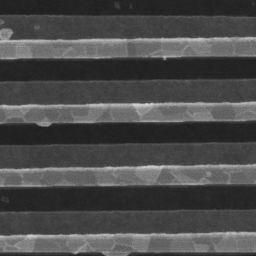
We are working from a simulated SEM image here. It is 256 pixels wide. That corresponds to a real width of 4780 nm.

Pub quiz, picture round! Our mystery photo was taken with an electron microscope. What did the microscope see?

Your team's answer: lines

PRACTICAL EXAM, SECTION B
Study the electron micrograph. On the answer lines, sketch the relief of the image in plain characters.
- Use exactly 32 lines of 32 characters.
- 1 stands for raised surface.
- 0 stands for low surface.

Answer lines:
00000000000000000000000000000000
00000000000000000000000000000000
11111111111111111111111111111111
11111111111111111111111111111111
11111111111111111111111111111111
11111111111111111111111111111111
11111111111111111111111111111111
00000000000000000000000000000000
00000000000000000000000000000000
00000000000000000000000000000000
11111111111111111111111111111111
11111111111111111111111111111111
11111111111111111111111111111111
11111111111111111111111111111111
11111111111111111111111111111111
00000110000000000000000000000000
00000000000000000000000000000000
00000000000000000000000000000000
11111111111111111111111111111111
11111111111111111111111111111111
11111111111111111111111111111111
11111111111111111111111111111111
11111111111111111111111111111111
00000000000000000000000000000000
00000000000000000000000000000000
00000000000000000000000000000000
00000000000011111111111111111111
11111111111111111111111111111111
11111111111111111111111111111111
11111111111111111111111111111111
11111111111111111111111111111111
00000000010011111001000000000000